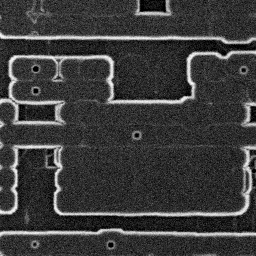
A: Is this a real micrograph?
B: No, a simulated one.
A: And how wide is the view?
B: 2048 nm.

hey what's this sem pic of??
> wiring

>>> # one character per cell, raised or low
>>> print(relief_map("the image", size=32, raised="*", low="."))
*****************....***********
******************...***********
********************************
********************************
********************************
................................
.............................***
.*************..........********
.*************..........********
.*************..........********
.*************..........********
.*************..........********
.*************.........*********
**.....************************.
**.....************************.
********************************
********************************
********************************
**.....*************************
**.....************************.
**.....************************.
**.....************************.
**.....************************.
**.....************************.
**.....************************.
**.....************************.
*......***********************..
................................
................................
********************************
********************************
********************************